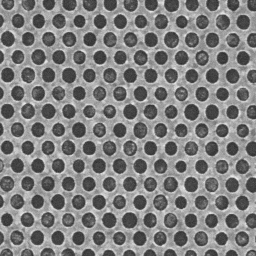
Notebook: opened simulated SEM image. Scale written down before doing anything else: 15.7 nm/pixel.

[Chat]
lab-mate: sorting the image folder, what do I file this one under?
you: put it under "a regular array of holes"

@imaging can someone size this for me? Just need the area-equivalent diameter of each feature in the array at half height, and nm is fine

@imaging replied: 232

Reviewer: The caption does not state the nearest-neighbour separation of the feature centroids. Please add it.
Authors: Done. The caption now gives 318 nm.